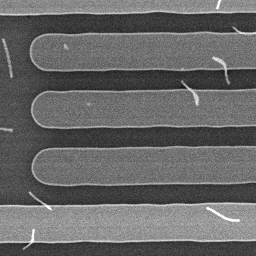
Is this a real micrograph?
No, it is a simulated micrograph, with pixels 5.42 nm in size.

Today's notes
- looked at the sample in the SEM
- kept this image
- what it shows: groups of lines, slits or small figures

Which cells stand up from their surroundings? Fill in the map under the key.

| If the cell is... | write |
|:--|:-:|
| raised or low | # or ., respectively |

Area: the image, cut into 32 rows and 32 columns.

################################
###################..#########.#
................................
................................
.....###########################
....############################
....############################
....############################
.....###########################
................................
................................
......##########################
....############################
....############################
....############################
.....###########################
................................
................................
...............#################
.....###########################
....############################
....############################
.....###########################
................................
................................
.........................#######
################################
################################
################################
################################
................................
................................